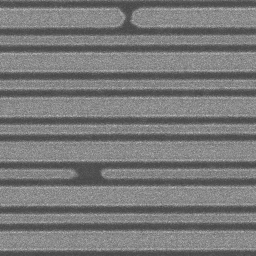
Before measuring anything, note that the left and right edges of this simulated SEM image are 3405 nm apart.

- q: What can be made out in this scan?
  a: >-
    parallel lines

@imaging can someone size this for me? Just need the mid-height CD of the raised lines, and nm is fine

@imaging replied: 141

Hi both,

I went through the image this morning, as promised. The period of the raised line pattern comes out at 290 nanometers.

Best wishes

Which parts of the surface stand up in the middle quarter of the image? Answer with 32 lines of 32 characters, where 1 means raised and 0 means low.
00000000000000000000000000000000
00000000000000000000000000000000
11111111111111111111111111111111
11111111111111111111111111111111
00000000000000000000000000000000
00000000000000000000000000000000
11111111111111111111111111111111
11111111111111111111111111111111
11111111111111111111111110000111
00000000000000000000000000000000
00000000000000000000000000000000
00000000000000000000000000000000
00000000000000000000000000000000
11111111111111111111111111111111
11111111111111111111111111111111
00000000000000000000000000000000
00000000000000000000000000000000
11111111111111111111111111111111
11111111111111111111111111111111
11111111111111111111111111111111
00000000000000000000000000000000
00000000000000000000000000000000
00000000000000000000000000000000
00000000000000000000000000000000
11111111111111111111111111111111
11111111111111111111111111111111
11111011110000000000000000000000
00111111110000000000000000000000
11111111111111111111111111111111
11111111111111111111111111111111
11111111111111111111111111111111
00000000000000000000000000000000